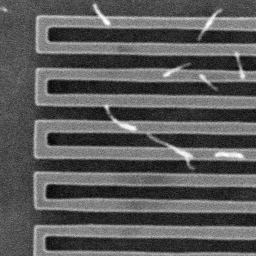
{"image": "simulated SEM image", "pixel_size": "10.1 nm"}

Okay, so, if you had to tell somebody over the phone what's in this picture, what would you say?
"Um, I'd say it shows groups of lines, slits or small figures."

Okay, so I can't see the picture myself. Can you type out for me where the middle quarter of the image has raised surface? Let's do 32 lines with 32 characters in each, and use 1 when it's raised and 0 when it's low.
00000000000000000000000000000000
11111111000000011111111111011000
11111111111111111111111111111111
11111111111111111111111111111111
00000000000000000000000000000000
00000000000000000000000000000000
00000000000000000000000000000000
00000000000000000000000000000000
11111111111111111111111111111111
11111111111111111111111111111111
00000001111111111111111111111111
00000000000000000000000000000000
00000000000000000000000000000000
00000000000000000000000000000000
11111111111111111111111100000000
11111111111111111111111111111111
11111111111111111111111111111111
00000000000000000000000000000000
00000000000000000000000000000000
00000000000000000000000000000000
00000000000000000000000000100000
11111111111111111111111111111111
11111111111111111111111111111111
11111111111111111111111111111111
00000000000000000000000000000000
00000000000000000000000000000000
00000000000000000000000000000000
11111111111111111111111100000000
11111111111111111111111111111111
11111111111111111111111111111111
00000000000000000000000000000000
00000000000000000000000000000000